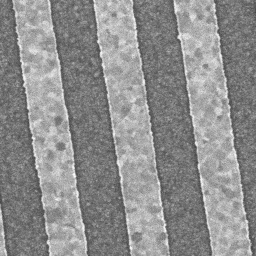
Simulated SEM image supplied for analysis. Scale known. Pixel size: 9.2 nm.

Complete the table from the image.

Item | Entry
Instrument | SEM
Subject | one or a few lines or trenches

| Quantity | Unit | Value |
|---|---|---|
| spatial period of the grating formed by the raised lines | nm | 742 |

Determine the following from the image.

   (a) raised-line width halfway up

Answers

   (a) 0.341 µm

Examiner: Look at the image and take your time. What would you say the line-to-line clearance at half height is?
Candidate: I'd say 396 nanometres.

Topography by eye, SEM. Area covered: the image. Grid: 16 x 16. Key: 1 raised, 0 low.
0110001100011000
0110001100011100
0110001110011100
0111001110011100
0111001110001100
0011000110001100
0011000110001100
0011000110001100
0011000111001110
0011100111001110
0011100111001110
0001100011000110
0001100011000110
0001100011000110
0001100011000110
0001100011100111